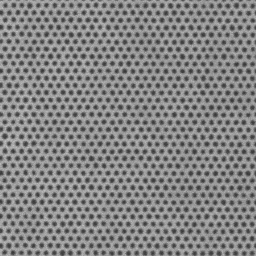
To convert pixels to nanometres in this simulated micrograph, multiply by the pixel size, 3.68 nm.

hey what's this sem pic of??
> a regular array of holes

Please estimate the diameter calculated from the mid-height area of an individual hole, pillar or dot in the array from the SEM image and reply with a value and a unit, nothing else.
18.1 nm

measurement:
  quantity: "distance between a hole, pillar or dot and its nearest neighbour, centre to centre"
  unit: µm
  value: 0.0294